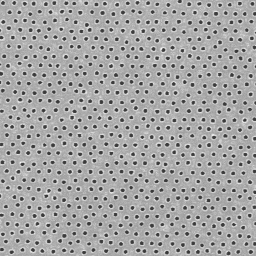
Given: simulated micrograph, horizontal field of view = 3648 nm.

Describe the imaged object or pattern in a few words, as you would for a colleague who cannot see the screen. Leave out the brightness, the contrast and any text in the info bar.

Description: a regular array of holes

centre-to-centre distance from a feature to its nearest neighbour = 122 nanometers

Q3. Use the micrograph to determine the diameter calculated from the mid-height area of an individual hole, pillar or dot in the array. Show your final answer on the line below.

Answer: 0.058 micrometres